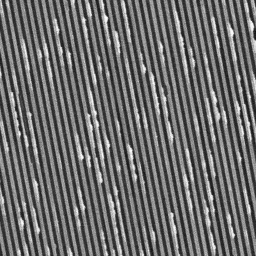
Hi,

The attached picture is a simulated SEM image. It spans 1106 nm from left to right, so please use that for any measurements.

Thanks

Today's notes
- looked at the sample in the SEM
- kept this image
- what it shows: parallel lines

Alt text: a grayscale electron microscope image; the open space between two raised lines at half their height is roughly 3.82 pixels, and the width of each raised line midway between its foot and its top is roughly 12.7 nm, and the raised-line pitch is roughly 0.0306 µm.